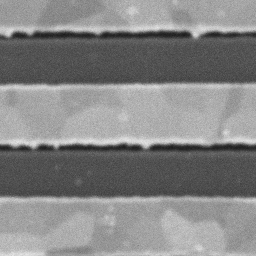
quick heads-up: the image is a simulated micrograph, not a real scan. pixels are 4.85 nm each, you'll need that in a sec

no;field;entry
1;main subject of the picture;lines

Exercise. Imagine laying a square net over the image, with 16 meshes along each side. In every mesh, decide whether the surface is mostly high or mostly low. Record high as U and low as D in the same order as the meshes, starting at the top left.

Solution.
UUUUUUUUUUUUUUUU
UUUUUUUUUUUUUUUU
DDDDDDDDDDDDDDDD
DDDDDDDDDDDDDDDD
DDDDDDDDDDDDDDDD
UUUUUUUUUUUUUUUU
UUUUUUUUUUUUUUUU
UUUUUUUUUUUUUUUU
UUUUUUUUUUUUUUUU
DDDDDDDDDDDDDDDD
DDDDDDDDDDDDDDDD
DDDDDDDDDDDDDDDD
UUUUUUUUUUUUUUUU
UUUUUUUUUUUUUUUU
UUUUUUUUUUUUUUUU
UUUUUUUUUUUUUUUU